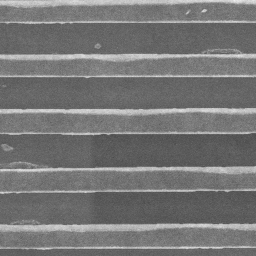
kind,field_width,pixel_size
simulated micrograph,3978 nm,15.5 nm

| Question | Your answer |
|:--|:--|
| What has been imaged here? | lines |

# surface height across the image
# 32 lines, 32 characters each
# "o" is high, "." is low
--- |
oooooooooooooooooooooooooooooooo
oooooooooooooooooooooooooooooooo
oooooooooooooooooooooooooooooooo
................................
................................
................................
................................
oooooooooooooooooooooooooooooooo
oooooooooooooooooooooooooooooooo
oooooooooooooooooooooooooooooooo
................................
................................
................................
................................
oooooooooooooooooooooooooooooooo
oooooooooooooooooooooooooooooooo
oooooooooooooooooooooooooooooooo
................................
................................
................................
................................
oooooooooooooooooooooooooooooooo
oooooooooooooooooooooooooooooooo
oooooooooooooooooooooooooooooooo
................................
................................
................................
................................
oooooooooooooooooooooooooooooooo
oooooooooooooooooooooooooooooooo
oooooooooooooooooooooooooooooooo
................................